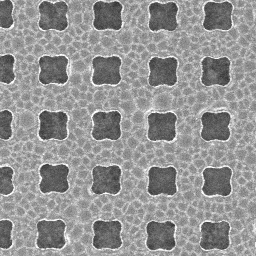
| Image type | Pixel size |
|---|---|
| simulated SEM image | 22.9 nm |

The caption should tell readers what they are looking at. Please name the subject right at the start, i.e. a regular array of holes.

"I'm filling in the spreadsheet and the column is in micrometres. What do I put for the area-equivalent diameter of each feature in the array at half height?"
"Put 0.723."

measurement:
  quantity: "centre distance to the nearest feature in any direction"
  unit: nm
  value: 1230